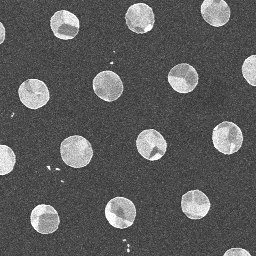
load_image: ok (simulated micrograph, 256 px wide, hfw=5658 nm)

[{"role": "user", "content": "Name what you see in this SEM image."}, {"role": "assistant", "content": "a regular array of raised bodies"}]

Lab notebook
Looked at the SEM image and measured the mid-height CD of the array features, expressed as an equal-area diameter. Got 661 nm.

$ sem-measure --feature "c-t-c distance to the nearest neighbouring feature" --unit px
73.9